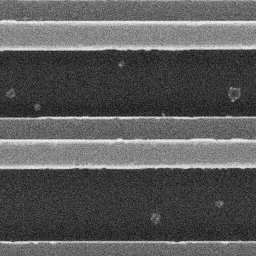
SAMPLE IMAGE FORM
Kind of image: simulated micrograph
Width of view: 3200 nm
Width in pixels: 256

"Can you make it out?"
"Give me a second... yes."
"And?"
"lines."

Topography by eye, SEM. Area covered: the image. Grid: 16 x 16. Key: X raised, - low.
XXXXXXXXXXXXXXXX
XXXXXXXXXXXXXXXX
XXXXXXXXXXXXXXXX
----------------
----------------
----------------
----------------
XXXXXXXXXXXXXXXX
XXXXXXXXXXXXXXXX
XXXXXXXXXXXXXXXX
XXXXX--XX-------
----------------
----------------
----------------
----------------
XXXXXXXXXXXXXXXX